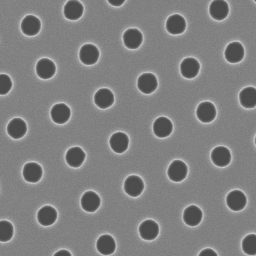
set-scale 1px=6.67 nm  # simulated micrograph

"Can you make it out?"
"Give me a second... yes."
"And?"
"a regular array of holes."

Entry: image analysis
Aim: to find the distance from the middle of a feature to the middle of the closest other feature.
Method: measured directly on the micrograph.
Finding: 305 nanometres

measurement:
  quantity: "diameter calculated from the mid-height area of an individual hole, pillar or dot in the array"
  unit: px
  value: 18.8